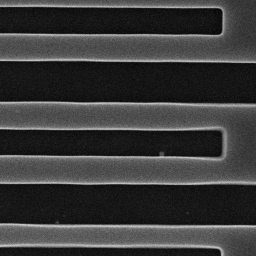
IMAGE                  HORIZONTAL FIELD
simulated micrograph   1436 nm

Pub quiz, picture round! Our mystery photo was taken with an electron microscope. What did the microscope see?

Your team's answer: groups of lines, slits or small figures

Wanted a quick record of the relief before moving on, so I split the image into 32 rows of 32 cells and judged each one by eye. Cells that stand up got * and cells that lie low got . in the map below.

********************************
............................****
............................****
............................****
********************************
********************************
********************************
******....**********************
................................
................................
................................
................................
................................
********************************
********************************
********************************
............................****
............................****
............................****
*******.....................****
********************************
********************************
********************************
................................
................................
................................
................................
................................
********************************
********************************
********************************
............................****